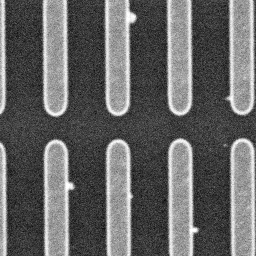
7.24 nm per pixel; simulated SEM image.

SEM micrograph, groups of lines, slits or small figures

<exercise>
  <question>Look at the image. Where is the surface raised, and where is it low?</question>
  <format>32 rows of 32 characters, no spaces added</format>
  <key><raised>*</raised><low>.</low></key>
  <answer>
......**.....***.....***.....**.
......**.....***.....***.....**.
......**.....***.....***.....**.
......**.....***.....***.....**.
......**.....***.....***.....**.
......**.....***.....***.....**.
......**.....***.....***.....**.
......**.....***.....***.....***
......**.....***.....***.....***
......**.....***.....***.....***
*.....**.....***.....***.....***
*.....**.....***.....***.....***
*.....**.....***.....***.....***
......**......**.....***.....**.
................................
................................
................................
..............................*.
......**......**.....***.....***
*.....**.....***.....***.....***
*.....**.....***.....***.....***
*.....**.....***.....***.....***
*.....**.....***.....***.....***
*.....**.....***.....***.....***
*.....**.....***.....***.....***
*.....**.....***.....***.....***
*.....**.....***.....***.....***
*.....**.....***.....***.....***
*.....**.....***.....***.....***
*.....**.....***.....***.....***
*.....**......**.....***.....***
*.....**......**.....***.....***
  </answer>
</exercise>